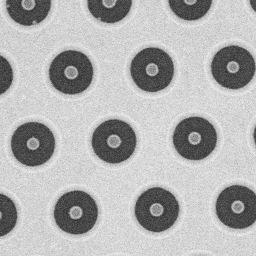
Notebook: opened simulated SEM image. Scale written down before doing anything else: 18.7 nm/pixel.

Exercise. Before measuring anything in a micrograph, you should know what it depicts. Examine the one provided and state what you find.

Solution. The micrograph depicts an array of small figures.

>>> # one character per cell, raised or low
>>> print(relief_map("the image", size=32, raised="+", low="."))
...+...++++..+...++++......++++.
+......++++......++++.....+++++.
+.....++++++....++++++...+++++++
+++.++++++++++++++++++++++++++++
++++++++++++++++++++++++++++++++
++++++++++++++++++++++++++++..++
+++++++....++++++....++++++.....
.+++++......++++......++++......
..++++..+...++++..++..++++...+..
..++++..+...++++......++++......
..++++......++++......+++++.....
.++++++....++++++...+++++++++.++
++++++++++++++++++++++++++++++++
++++++++++++++++++++++++++++++++
+++++++++++++++++++++++...++++++
++....++++++.....+++++.....+++++
+......++++......++++......++++.
+...+..++++...+..++++...+...+++.
+...+..++++......++++......+++++
+......+++++.....+++++....++++++
++....+++++++...++++++++++++++++
++++++++++++++++++++++++++++++++
++++++++++++++++++++++++++++++++
+++++++++.++++++++...+++++++....
..+++++.....+++++.....+++++.....
..+++++.....+++++......++++..+..
...+++...+...+++...+...++++..+..
..++++.......++++.....+++++.....
..+++++.....+++++.....++++++....
.+++++++...+++++++++++++++++++++
++++++++++++++++++++++++++++++++
++++++++++++++++++++++++++++++++